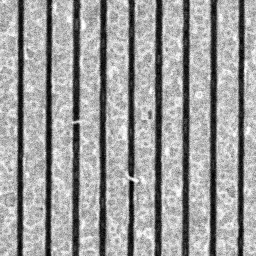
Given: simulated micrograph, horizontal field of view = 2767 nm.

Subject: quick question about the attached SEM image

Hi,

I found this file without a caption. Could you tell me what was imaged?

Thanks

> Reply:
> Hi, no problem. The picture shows parallel lines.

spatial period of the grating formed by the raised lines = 298 nanometres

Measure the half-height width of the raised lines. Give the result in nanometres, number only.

228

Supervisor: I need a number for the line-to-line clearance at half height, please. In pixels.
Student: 6.25